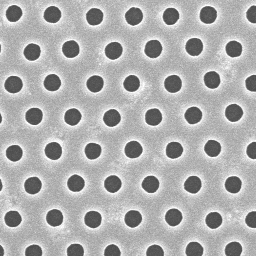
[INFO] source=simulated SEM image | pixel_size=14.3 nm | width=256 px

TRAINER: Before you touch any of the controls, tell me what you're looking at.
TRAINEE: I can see a regular array of holes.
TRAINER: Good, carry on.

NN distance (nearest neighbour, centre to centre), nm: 541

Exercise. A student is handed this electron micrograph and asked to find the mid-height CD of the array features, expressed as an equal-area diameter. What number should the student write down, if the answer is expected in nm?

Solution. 256